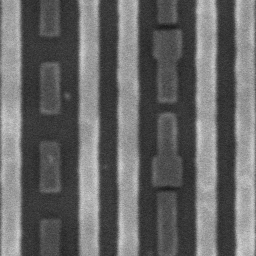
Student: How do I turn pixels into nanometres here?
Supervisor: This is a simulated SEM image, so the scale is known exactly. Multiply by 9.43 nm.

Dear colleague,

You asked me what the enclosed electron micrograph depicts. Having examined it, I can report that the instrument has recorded wiring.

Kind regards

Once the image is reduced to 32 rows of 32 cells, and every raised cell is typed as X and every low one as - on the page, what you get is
XX---XX---XX---XX---XX---XX---XX
XX---XX---XX---XX---XX---XX--XXX
XX---XX---XX---XX---XX---XX--XXX
XX---XX---XX---XX--------XX---XX
XX--------XX---XX--XXXX--XX---XX
XX--------XX---XX--XXXX--XX---XX
XX--------XX---XX--XXX---XX---XX
XX--------XX---XX---XX---XX---XX
XX---XX---XX---XX---XX---XX--XXX
XX---XX---XX---XX---XX---XX---XX
XX---XX---XX---XX---XX---XX---XX
XX---XX---XX---XX---XX---XX---XX
XX---XX---XX---XX---XX---XX---XX
XX---XX---XX---XX--------XX---XX
XX--------XX---XX--------XX---XX
XX--------XX---XX---XX---XX---XX
XX--------XX---XX---XX---XX---XX
XX--------XX---XX---XX---XX---XX
XX---XX---XX---XX---XX---XX---XX
XX---XX---XX---XX---XX---XX---XX
XX---XX---XX---XX--XXXX--XX---XX
XX---XX---XX---XX--XXXX--XX---XX
XX---XX---XX---XX--XXXX--XX---XX
XX---XX---XX---XX--------XX---XX
XX--------XX---XX---XX---XX---XX
XX--------XX---XX---XX---XX---XX
XX--------XX---XX---XX---XX---XX
XX--------XX---XX---XX---XX---XX
XX---XX---XX---XX---XX---XX---XX
XX---XX---XX---XX---XX---XX---XX
XX---XX---XX---XX---XX---XX---XX
XX---XX---XX---XX---XX---XX---XX